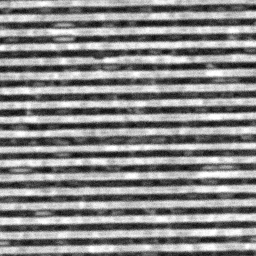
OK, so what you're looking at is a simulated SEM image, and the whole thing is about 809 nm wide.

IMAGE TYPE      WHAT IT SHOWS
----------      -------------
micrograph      parallel lines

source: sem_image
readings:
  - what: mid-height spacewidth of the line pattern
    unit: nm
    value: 28.8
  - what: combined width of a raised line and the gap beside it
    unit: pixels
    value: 14.5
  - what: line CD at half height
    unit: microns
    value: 0.0174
